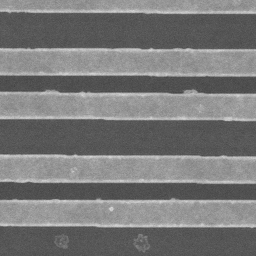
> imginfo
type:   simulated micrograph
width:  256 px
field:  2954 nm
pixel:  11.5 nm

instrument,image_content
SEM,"lines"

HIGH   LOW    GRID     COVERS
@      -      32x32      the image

@@@@@@@@@@@@@@@@@@@@@@@@@@@@@@@@
---@@@@@@@@@@@@@@@@@@@@@@@@@@@@@
--------------------------------
--------------------------------
--------------------------------
--------------------------------
@@@@@@@@@@@@@@@@@@@@@@@@@@@@@@@@
@@@@@@@@@@@@@@@@@@@@@@@@@@@@@@@@
@@@@@@@@@@@@@@@@@@@@@@@@@@@@@@@@
--------------------------------
--------------------------------
--------------------------------
@@@@@@@@@@@@@@@@@@@@@@@@@@@@@@@@
@@@@@@@@@@@@@@@@@@@@@@@@@@@@@@@@
@@@@@@@@@@@@@@@@@@@@@@@@@@@@@@@@
--------------------------------
--------------------------------
--------------------------------
--------------------------------
@-@@@@@@------------------------
@@@@@@@@@@@@@@@@@@@@@@@@@@@@@@@@
@@@@@@@@@@@@@@@@@@@@@@@@@@@@@@@@
@@@@@@@@@@@@@@@@@@@@@@@@@@@@@@@@
--------------------------------
--------------------------------
@@@@@@@@@@@@@@@@@@@@@@@@@@@@@@@@
@@@@@@@@@@@@@@@@@@@@@@@@@@@@@@@@
@@@@@@@@@@@@@@@@@@@@@@@@@@@@@@@@
--------------------------------
--------------------------------
--------------------------------
--------------------------------